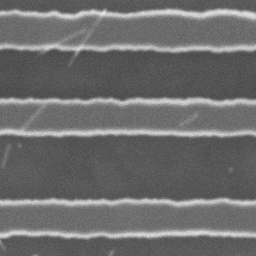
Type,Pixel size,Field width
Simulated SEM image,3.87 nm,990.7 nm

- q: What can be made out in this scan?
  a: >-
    lines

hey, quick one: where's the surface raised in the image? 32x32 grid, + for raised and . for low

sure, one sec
................................
+++.......+++.....+++++...++++..
++++++++++++++++++++++++++++++++
++++++++++++++++++++++++++++++++
++++++++++++++++++++++++++++++++
++++++++++++++++++++++++++++++++
................................
................................
................................
................................
................................
................................
.+.++.++...++++.++..++.+++...++.
++++++++++++++++++++++++++++++++
++++++++++++++++++++++++++++++++
++++++++++++++++++++++++++++++++
++++++++++++++++++++++++++++++++
................................
................................
................................
................................
................................
................................
................................
................................
++++++++++++++++++++++++++++++++
++++++++++++++++++++++++++++++++
++++++++++++++++++++++++++++++++
++++++++++++++++++++++++++++++++
+.......++++.++...+.............
................................
................................